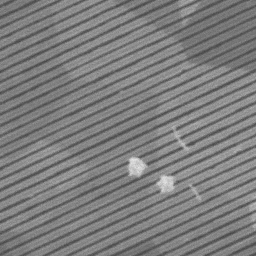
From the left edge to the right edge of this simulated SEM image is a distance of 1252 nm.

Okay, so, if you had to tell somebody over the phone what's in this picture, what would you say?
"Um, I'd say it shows parallel lines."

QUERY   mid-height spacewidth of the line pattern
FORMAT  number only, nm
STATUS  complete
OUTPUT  19.4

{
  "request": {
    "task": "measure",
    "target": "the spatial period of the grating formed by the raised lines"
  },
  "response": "47.8 nm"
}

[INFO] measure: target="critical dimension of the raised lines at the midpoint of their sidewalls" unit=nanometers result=28.8